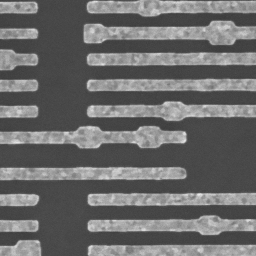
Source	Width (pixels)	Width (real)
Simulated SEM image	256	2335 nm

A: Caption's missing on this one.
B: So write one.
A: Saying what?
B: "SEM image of wiring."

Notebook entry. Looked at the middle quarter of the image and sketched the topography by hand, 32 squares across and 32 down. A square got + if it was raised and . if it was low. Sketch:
................................
................................
................................
................................
......++++++++++++++++++++++++++
......++++++++++++++++++++++++++
......+++++++++++++++++.........
................................
................................
................................
................++++...+++++++++
......++++++++++++++++++++++++++
......++++++++++++++++++++++++++
.........................+++++..
................................
................................
...++++++.........++++++........
++++++++++++++++++++++++++++++..
++++++++++++++++++++++++++++++..
++++++++++++++++++++++++++++++..
...++++++..........+++++........
................................
................................
................................
................................
................................
++++++++++++++++++++++++++++++..
++++++++++++++++++++++++++++++..
++++++++++++++++++++++++++++++..
................................
................................
................................